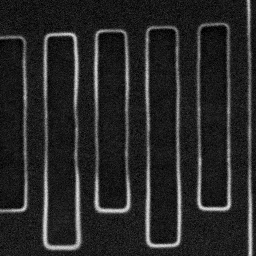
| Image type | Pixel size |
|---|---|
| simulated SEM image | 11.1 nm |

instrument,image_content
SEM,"groups of lines, slits or small figures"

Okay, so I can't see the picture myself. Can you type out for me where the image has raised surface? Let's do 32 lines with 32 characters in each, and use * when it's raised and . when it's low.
*******************************.
*******************************.
*******************************.
*******************..****...***.
******...***....**....***...***.
...***...***....**....***...***.
...***...***....**....***....**.
...***....**....**....***...***.
...***....**....**....***...***.
...***....**....**....***....**.
...***...***....**....***....**.
...***...***....**....***....**.
...***...***....**....***....**.
...***...***....**....***....**.
...***...***....***...***....**.
...***....**....***...***....**.
...***....**....***...***....**.
...***....**....***...***....**.
...***...***....***...***....**.
...***...***....***...***....**.
...***...***....***...***....**.
...***....**....***...***....**.
...***....**....***...***....**.
...***....**....***...***....**.
...***....**....***...***....**.
...***....**....***...***....**.
******....********....*********.
******....********....*********.
******....********....*********.
******....*********...*********.
******....*********...*********.
*******************************.